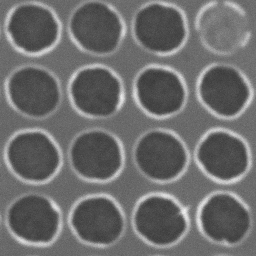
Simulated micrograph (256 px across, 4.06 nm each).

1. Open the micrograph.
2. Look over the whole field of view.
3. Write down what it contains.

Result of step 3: a regular array of holes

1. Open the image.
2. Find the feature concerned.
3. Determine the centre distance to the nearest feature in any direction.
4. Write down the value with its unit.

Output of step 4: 255 nanometers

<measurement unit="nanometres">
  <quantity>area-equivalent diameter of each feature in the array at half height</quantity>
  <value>203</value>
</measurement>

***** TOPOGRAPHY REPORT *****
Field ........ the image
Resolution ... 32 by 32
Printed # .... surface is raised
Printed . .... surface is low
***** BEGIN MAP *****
###########..######.############
##....###.....###.....##########
#......##......##......#########
#......##......##......#########
#......##......##......#########
##.....###.....###.....#########
###..######...######.###########
################################
###..######..#############...###
#......###....###.....###.....##
#......##......##......##......#
#......##......##......##......#
#......##......##......##......#
##.....###.....###.....###....##
####..######.###############.###
################################
####.######..######.#######.####
##....###.....####....###.....##
#......##......##......##......#
#......##......##......##......#
#......##......##......##......#
##.....###.....###.....###....##
###...#############..###########
################################
###..######################..###
##....####....###.....####....##
#......##......##......##......#
#......##......##......##......#
#......##......##......##......#
##.....###.....###.....###.....#
###################..###########
################################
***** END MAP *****